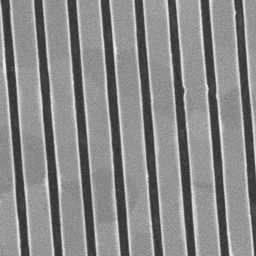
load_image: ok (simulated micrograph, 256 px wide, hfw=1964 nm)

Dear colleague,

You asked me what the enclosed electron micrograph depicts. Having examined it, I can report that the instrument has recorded parallel lines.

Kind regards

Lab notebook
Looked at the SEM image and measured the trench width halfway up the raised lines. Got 74.5 nm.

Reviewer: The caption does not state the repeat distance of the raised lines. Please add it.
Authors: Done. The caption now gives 254 nm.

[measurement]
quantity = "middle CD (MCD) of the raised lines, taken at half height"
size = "0.181 microns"